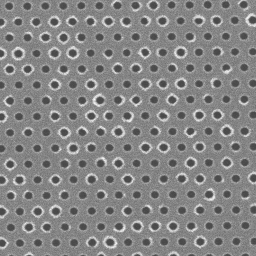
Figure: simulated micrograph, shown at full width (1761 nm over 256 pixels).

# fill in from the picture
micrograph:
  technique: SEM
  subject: a regular array of holes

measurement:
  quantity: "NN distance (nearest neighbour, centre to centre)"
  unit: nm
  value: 123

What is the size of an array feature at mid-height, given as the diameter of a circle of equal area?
0.0509 µm